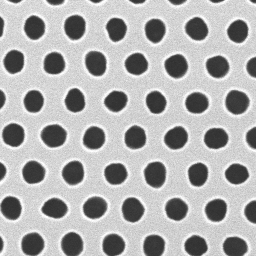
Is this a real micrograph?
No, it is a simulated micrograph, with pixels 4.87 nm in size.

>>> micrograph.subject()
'a regular array of holes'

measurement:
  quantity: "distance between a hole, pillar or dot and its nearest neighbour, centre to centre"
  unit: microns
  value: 0.194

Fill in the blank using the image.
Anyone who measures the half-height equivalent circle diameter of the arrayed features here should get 0.108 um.